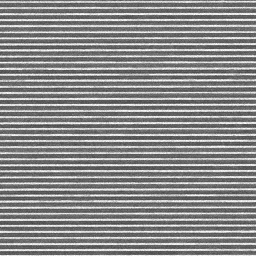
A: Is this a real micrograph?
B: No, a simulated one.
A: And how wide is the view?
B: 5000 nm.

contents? parallel lines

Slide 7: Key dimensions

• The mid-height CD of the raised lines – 34.2 nm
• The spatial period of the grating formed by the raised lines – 118 nm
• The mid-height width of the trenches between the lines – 80.6 nanometers